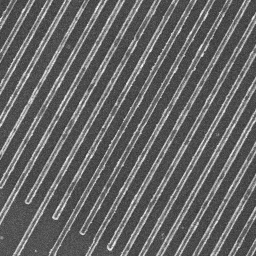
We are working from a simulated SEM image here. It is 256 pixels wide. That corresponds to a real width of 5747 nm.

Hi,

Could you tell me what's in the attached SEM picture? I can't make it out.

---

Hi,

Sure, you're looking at parallel lines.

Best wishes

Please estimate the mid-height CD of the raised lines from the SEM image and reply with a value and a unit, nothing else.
4.81 px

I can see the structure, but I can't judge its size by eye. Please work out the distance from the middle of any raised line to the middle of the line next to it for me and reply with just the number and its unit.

0.352 um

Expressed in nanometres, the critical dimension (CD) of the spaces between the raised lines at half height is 238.